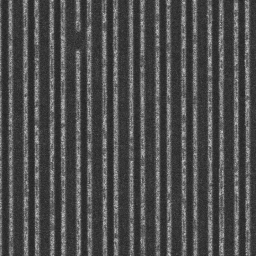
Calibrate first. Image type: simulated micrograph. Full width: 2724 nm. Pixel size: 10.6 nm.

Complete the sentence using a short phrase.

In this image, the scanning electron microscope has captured parallel lines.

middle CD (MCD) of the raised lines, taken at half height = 0.0492 micrometres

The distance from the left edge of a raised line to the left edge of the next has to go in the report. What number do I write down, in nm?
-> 140